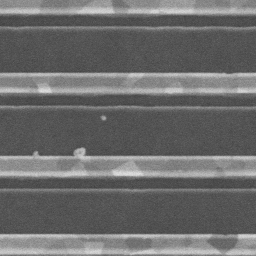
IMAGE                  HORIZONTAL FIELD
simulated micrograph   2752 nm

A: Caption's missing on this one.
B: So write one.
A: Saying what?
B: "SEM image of lines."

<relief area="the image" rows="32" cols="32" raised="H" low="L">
HHHHHHHHHHHHHHHHHHHHHHHHHHHHHHHH
HHHHHHHHHHLHHHHHHHHHHHHHHHHHHHHH
LLLLLLLLLLLLLLLLLLLLLLLLLLLLLLLL
LLLLLLLLLLLLLLLLLLLLLLLLLLLLLLLL
LLLLLLLLLLLLLLLLLLLLLLLLLLLLLLLL
LLLLLLLLLLLLLLLLLLLLLLLLLLLLLLLL
LLLLLLLLLLLLLLLLLLLLLLLLLLLLLLLL
LLLLLLLLLLLLLLLLLLLLLLLLLLLLLLLL
LLLLLLLLLLLLLLLLLLLLLLLLLLLLLLLL
HHHHHHHHHHHHHHHHHHHHHHHHHHHHHHHH
HHHHHHHHHHHHHHHHHHHHHHHHHHHHHHHH
LLLLLLLLLLLLLLLLLLLLLLLLLLLLLLLL
LLLLLLLLLLLLLLLLLLLLLLLLLLLLLLLL
LLLLLLLLLLLLLLLLLLLLLLLLLLLLLLLL
LLLLLLLLLLLLLLLLLLLLLLLLLLLLLLLL
LLLLLLLLLLLLLLLLLLLLLLLLLLLLLLLL
LLLLLLLLLLLLLLLLLLLLLLLLLLLLLLLL
LLLLLLLLLLLLLLLLLLLLLLLLLLLLLLLL
LLLLLLLLLLLLLLLLLLLLLLLLLLLLLLLL
LLLLLLLLLLLLLLLLLLLLLLLLLLLLLLLL
HHHHHHHHHHHHHHHHHHHHHHHHHHHHHHHH
HHHHHHHHHHHHHHHHHHHHHHHHHHHHHHHH
LLLLLLLLLLLLLLLLLLLLLLLLLLLLLLLL
LLLLLLLLLLLLLLLLLLLLLLLLLLLLLLLL
LLLLLLLLLLLLLLLLLLLLLLLLLLLLLLLL
LLLLLLLLLLLLLLLLLLLLLLLLLLLLLLLL
LLLLLLLLLLLLLLLLLLLLLLLLLLLLLLLL
LLLLLLLLLLLLLLLLLLLLLLLLLLLLLLLL
LLLLLLLLLLLLLLLLLLLLLLLLLLLLLLLL
HHHHHHHHHHHHHHHHHHHHHHHHHHHHHHHH
HHHHHHHHHHHHHHHHHHHHHHHHHHHHHHHH
HHHHHHHHHHHHHHHHHHHHHHHHHHHHHHHH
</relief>